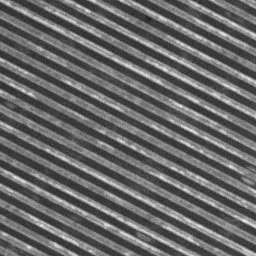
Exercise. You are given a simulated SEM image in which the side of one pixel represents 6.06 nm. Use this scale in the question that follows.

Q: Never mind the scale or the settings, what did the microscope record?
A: parallel lines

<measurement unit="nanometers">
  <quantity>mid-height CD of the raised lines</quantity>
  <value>33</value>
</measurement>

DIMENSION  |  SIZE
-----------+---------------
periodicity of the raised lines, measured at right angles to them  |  84.5 nanometers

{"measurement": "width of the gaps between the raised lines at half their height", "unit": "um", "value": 0.0511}